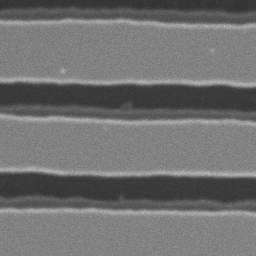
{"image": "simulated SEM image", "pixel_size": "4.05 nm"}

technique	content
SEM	lines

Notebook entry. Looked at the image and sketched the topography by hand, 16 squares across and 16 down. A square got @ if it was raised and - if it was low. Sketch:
----------------
@@@@@@@@@@@-----
@@@@@@@@@@@@@@@@
@@@@@@@@@@@@@@@@
@@@@@@@@@@@@@@@@
----------------
----------------
@@@@@@@----@@-@-
@@@@@@@@@@@@@@@@
@@@@@@@@@@@@@@@@
@@@@@@@@@@@@@@@@
----------------
----------------
@@@@@@@@@@@@@@@@
@@@@@@@@@@@@@@@@
@@@@@@@@@@@@@@@@